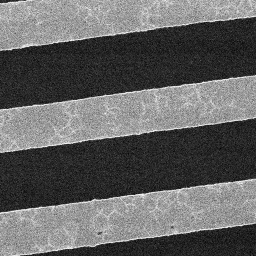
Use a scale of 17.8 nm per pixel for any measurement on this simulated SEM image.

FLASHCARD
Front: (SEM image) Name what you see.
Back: one or a few lines or trenches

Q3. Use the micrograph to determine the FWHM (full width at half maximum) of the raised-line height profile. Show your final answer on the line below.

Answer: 750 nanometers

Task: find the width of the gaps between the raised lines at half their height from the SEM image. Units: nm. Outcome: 1070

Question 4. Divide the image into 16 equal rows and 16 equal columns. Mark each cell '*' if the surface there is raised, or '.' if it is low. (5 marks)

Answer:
****************
************....
*****...........
................
................
..........******
...*************
***************.
********........
................
................
..............**
......**********
****************
************....
****............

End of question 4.